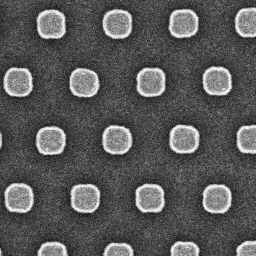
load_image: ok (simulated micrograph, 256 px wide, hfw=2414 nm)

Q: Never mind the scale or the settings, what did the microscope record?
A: a regular array of raised bodies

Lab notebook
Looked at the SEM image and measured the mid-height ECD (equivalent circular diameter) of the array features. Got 0.266 um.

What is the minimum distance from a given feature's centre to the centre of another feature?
620 nm